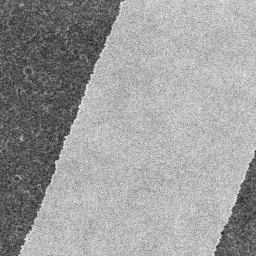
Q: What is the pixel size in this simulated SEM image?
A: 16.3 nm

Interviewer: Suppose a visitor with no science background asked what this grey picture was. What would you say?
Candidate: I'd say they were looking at one or a few lines or trenches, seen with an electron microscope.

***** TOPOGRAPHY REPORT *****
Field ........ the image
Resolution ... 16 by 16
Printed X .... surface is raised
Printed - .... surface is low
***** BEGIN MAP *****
--------XXXXXXXX
-------XXXXXXXXX
-------XXXXXXXXX
------XXXXXXXXXX
------XXXXXXXXXX
-----XXXXXXXXXXX
-----XXXXXXXXXXX
-----XXXXXXXXXXX
----XXXXXXXXXXXX
----XXXXXXXXXXXX
---XXXXXXXXXXXX-
---XXXXXXXXXXXX-
---XXXXXXXXXXXX-
--XXXXXXXXXXXX--
--XXXXXXXXXXXX--
-XXXXXXXXXXXX---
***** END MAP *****